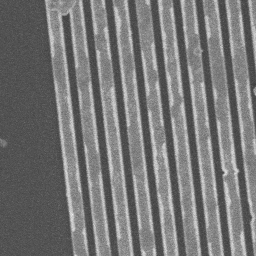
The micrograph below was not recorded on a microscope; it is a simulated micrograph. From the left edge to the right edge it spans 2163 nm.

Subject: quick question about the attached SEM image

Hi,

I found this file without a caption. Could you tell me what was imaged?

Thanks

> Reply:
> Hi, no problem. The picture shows parallel lines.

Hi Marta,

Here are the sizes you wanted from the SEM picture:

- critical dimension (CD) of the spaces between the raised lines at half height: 8.32 pixels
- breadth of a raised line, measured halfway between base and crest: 0.121 um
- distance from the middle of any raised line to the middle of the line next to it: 189 nm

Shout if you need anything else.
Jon